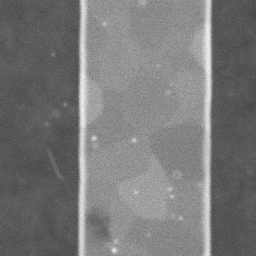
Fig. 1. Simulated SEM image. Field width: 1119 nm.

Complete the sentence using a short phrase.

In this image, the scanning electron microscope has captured wiring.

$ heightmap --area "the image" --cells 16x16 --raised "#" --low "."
.....########...
.....########...
.....########...
.....########...
.....########...
.....########...
.....########...
.....########...
.....########...
.....########...
.....########...
.....########...
.....########...
.....########...
.....########...
.....########...